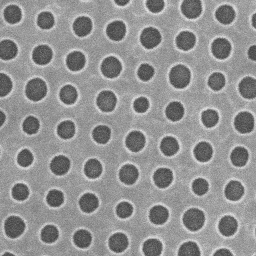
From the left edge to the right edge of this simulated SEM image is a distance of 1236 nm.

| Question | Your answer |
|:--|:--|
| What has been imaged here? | a regular array of holes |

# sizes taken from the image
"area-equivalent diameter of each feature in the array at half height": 104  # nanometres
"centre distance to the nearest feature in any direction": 162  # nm